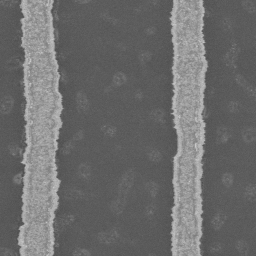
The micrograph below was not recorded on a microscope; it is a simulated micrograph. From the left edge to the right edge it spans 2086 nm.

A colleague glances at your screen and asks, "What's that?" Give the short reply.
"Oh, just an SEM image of one or a few lines or trenches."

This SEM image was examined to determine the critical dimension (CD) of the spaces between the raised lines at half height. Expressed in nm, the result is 990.